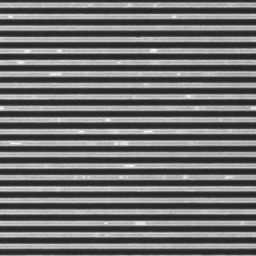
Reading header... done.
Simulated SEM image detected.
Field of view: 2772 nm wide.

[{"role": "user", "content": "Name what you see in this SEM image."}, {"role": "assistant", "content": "parallel lines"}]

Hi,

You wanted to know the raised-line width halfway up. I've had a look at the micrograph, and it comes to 58.2 nm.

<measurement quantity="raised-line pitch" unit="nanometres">124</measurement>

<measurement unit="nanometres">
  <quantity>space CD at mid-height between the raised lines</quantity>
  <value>67.7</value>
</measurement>